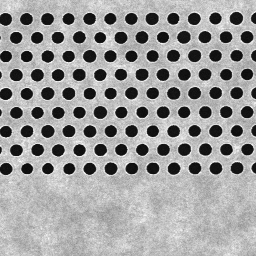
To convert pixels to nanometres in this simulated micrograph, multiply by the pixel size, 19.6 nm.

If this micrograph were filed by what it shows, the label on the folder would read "a regular array of holes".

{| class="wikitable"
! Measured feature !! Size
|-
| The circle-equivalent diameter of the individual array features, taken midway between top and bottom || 0.241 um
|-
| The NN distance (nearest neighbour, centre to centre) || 408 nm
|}